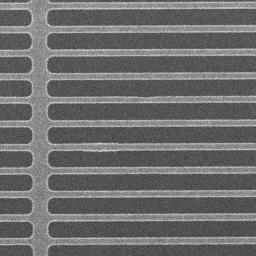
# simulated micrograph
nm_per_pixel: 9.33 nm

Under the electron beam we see parallel lines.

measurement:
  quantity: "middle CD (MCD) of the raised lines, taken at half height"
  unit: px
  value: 6.25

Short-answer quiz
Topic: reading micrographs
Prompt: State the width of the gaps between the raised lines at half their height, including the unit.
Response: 162 nanometres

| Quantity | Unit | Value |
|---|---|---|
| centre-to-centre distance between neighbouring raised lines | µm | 0.22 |